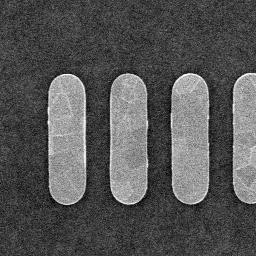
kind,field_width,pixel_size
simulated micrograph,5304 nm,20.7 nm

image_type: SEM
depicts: groups of lines, slits or small figures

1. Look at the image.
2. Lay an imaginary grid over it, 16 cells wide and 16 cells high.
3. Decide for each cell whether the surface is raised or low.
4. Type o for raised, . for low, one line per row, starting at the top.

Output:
................
................
................
................
................
...oo..oo..oo..o
...oo..oo..oo..o
...oo..oo..oo..o
...oo..oo..oo..o
...oo..oo..oo..o
...oo..oo..oo..o
...oo..oo..oo..o
....o..oo..oo..o
................
................
................